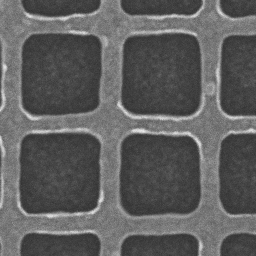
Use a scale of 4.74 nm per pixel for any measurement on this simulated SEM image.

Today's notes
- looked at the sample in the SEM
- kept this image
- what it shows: holes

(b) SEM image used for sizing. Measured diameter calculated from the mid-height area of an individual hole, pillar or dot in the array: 425 nm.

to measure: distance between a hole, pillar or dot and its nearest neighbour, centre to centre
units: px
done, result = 99.3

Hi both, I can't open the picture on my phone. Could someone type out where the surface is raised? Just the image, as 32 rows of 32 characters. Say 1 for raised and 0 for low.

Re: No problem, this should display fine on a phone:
11100000000001100000000001100000
11100000000011110000000001110000
11111111111111111111111111111111
11111111111111111111111111111111
11110000000011110000000011110000
11100000000001100000000001110000
11100000000001100000000001110000
11100000000001100000000001110000
11100000000001100000000001110000
11100000000001100000000001110000
11100000000011100000000001110000
11100000000011100000000001100000
11100000000001100000000001100000
11100000000011100000000001110000
11110001111111111111100111111000
11111111111111111111111111111111
11111111101111111111111111111111
11100000000011100000000011110000
11000000000001100000000001100000
11000000000001100000000001100000
11000000000011100000000001100000
11100000000001100000000001100000
11000000000001100000000001100000
11000000000001100000000001100000
11100000000011100000000001100000
11100000000011100000000001110000
11100000000111110000000011110000
11111111111111111111111111111111
11111111111111111111111111111111
11100000000011110000000011110000
11000000000001100000000001110000
11000000000001100000000001100000